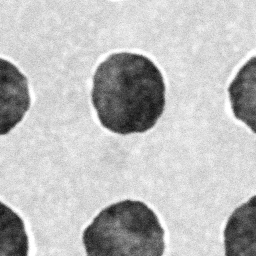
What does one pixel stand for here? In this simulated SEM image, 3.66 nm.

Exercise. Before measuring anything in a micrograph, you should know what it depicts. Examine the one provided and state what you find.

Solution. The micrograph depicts holes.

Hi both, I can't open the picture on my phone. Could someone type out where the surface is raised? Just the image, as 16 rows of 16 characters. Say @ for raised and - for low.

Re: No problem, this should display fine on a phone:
@@@@@@@@@@@@@@@@
@@@@@@@@@@@@@@@@
@@@@@@@@@@@@@@@@
@@@@@@@--@@@@@@@
-@@@@@----@@@@@-
--@@@@----@@@@--
--@@@@----@@@@--
-@@@@@----@@@@@-
@@@@@@@@@@@@@@@@
@@@@@@@@@@@@@@@@
@@@@@@@@@@@@@@@@
@@@@@@@@@@@@@@@@
@@@@@@@@@@@@@@@-
-@@@@@----@@@@--
--@@@-----@@@@--
--@@@-----@@@@--